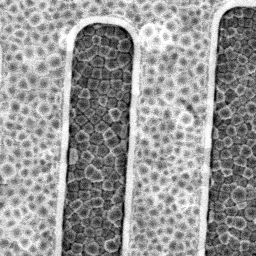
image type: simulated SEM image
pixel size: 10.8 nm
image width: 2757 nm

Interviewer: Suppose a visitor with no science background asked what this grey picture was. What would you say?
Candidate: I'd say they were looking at one or a few lines or trenches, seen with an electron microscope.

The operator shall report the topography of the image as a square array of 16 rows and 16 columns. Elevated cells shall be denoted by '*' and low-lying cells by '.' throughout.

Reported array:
**************..
*****...*****...
****....*****...
****.....****...
****....*****...
****....*****...
****....*****...
****....*****...
****....*****...
****....*****...
****....*****...
****....*****...
****....*****...
****....*****...
****....*****...
****....*****...